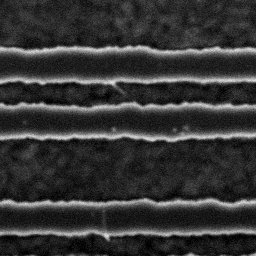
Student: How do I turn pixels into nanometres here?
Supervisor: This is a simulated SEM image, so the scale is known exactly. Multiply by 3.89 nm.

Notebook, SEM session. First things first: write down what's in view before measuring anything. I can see lines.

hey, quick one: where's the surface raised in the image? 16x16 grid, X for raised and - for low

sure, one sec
----------------
----------------
----------------
XXXXXXXXXXXXXXXX
XXXXXXXXXXXXXXXX
----------------
------------X---
XXXXXXXXXXXXXXXX
XXXXXXXXXXXXXXXX
----------------
----------------
----------------
----------------
XXXXXXXXXXXXXXXX
XXXXXXXXXXXXXXXX
----------------